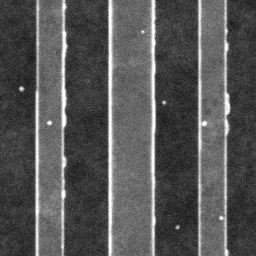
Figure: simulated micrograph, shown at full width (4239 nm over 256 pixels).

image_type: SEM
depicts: lines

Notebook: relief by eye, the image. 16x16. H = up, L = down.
LLHHLLLHHHLLHHLL
LLHHLLLHHHLLHHLL
LLHHLLLHHHLLHHLL
LLHHLLLHHHLLHHLL
LLHHLLLHHHLLHHLL
LLHHLLLHHHLLHHLL
LLHHLLLHHHLLHHLL
LLHHLLLHHHLLHHLL
LLHHLLLHHHLLHHLL
LLHHLLLHHHLLHHLL
LLHHLLLHHHLLHHLL
LLHHLLLHHHLLHHLL
LLHHLLLHHHLLHHLL
LLHHLLLHHHLLHHLL
LLHHLLLHHHLLHHLL
LLHHLLLHHHLLHHLL